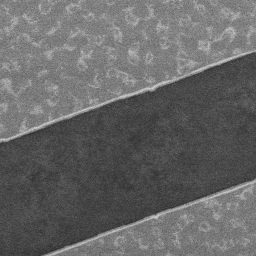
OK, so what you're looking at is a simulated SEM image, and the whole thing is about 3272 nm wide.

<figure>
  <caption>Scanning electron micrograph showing one or a few lines or trenches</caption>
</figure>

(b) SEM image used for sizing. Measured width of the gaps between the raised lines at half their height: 1580 nanometers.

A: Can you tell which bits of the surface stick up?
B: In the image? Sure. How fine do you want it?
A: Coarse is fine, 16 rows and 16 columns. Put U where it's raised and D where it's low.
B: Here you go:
UUUUUUUUUUUUUUUU
UUUUUUUUUUUUUUUU
UUUUUUUUUUUUUUUU
UUUUUUUUUUUUUUUD
UUUUUUUUUUUUDDDD
UUUUUUUUUDDDDDDD
UUUUUUDDDDDDDDDD
UUUDDDDDDDDDDDDD
UDDDDDDDDDDDDDDD
DDDDDDDDDDDDDDDD
DDDDDDDDDDDDDDDD
DDDDDDDDDDDDDDDU
DDDDDDDDDDDDDUUU
DDDDDDDDDDUUUUUU
DDDDDDDUUUUUUUUU
DDDDUUUUUUUUUUUU